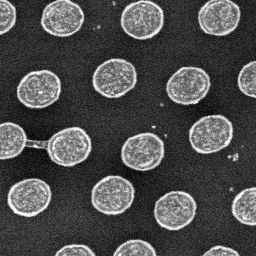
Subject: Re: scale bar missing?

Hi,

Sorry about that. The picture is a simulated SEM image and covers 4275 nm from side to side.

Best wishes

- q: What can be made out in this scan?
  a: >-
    a regular array of raised bodies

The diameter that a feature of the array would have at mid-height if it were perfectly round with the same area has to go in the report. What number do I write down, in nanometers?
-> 653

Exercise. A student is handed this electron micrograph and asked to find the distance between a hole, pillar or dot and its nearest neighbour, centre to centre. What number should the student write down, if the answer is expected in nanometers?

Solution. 1070